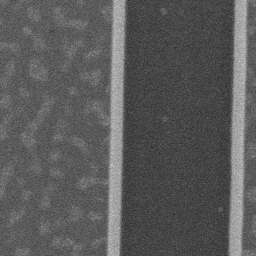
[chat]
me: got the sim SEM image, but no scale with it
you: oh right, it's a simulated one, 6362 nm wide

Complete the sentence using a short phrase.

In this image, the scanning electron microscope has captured one or a few lines or trenches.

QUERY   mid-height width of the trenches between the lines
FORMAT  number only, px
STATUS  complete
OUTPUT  121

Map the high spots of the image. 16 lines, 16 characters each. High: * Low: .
*******........*
*******........*
*******........*
*******........*
*******........*
*******........*
*******........*
*******........*
*******........*
*******........*
*******........*
*******........*
*******........*
*******........*
*******........*
*******........*